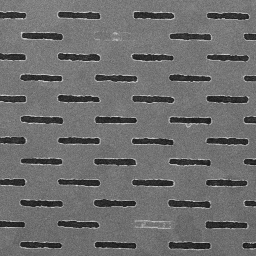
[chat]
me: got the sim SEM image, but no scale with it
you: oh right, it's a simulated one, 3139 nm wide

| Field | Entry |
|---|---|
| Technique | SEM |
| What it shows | a regular array of holes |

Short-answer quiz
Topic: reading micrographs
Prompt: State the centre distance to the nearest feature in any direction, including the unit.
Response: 510 nm